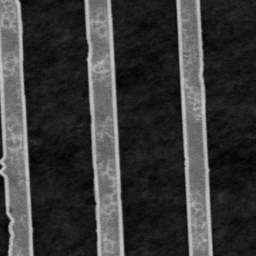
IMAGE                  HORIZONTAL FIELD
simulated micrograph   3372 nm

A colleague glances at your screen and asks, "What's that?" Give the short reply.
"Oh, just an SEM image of one or a few lines or trenches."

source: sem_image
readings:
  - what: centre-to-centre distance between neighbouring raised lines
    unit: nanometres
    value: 1190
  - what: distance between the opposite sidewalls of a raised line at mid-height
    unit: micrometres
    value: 0.288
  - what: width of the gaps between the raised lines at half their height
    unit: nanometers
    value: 898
